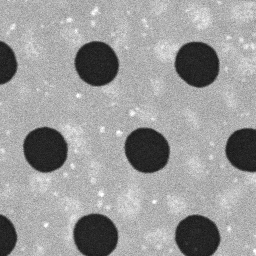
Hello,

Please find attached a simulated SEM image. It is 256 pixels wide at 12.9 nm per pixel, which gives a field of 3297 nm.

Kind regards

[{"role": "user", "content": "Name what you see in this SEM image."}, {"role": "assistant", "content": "holes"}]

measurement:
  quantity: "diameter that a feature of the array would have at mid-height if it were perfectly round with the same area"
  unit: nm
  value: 581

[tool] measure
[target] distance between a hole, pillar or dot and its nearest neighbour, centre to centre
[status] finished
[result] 1290 nanometers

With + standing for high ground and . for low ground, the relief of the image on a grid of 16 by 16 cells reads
++++++++++++++++
++++++++++++++++
++++++++++++++++
.++++..++++...++
.++++..++++...++
++++++++++++++++
++++++++++++++++
++++++++++++++++
++..++++..++++..
++..++++...+++..
++..++++..+++++.
++++++++++++++++
++++++++++++++++
+++++..+++++++++
.++++..++++...++
.++++..++++...++